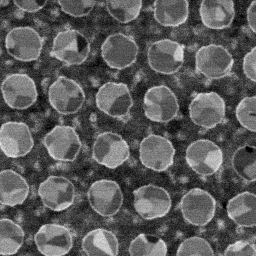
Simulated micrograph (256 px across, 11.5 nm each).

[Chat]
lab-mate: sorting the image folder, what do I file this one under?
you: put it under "a regular array of raised bodies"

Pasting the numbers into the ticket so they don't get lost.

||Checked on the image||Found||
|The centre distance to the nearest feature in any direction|542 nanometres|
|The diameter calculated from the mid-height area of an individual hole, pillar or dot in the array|402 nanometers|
